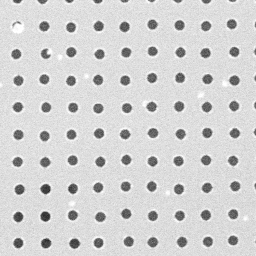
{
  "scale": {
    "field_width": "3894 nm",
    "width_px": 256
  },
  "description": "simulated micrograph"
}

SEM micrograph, a regular array of holes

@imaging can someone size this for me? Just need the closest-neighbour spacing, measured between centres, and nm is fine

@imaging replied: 395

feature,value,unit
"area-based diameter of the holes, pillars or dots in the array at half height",0.17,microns